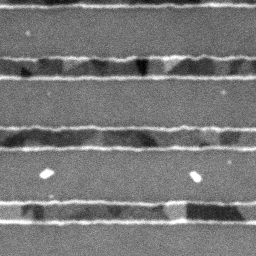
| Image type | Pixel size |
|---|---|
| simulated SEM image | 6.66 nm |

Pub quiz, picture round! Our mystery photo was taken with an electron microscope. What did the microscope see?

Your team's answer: lines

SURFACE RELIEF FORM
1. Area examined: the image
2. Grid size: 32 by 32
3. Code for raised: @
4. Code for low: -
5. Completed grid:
@@@@@@@@@@@@@@@@@@@@@@@@@@@@@@@@
--------------------------------
--------------------------------
--------------------------------
--------------------------------
--------------------------------
--------------------------------
@@@@@@@@@@@@@@@@@@@@@@@@@@@@@@@@
@@@@@@@@@@@@@@@@@@@@@@@@@@@@@@@@
@@@@@@@@@@@@@@@@@@@@@@@@@@@@@@@@
--------------------------------
--------------------------------
--------------------------------
--------------------------------
--------------------------------
--------------------------------
@@@@@@@@@@@@@@@@@@@@@@@@@@@@@@@@
@@@@@@@@@@@@@@@@@@@@@@@@@@@@@@@@
@@@@@@@@@@@@@@@@@@@@@@@@@@-@@@@@
--------------------------------
--------------------------------
--------------------------------
--------------------------------
--------------------------------
--------------------------------
@@@@@@@@@@@@@@@@@@@@@@@@@@@@@@@@
@@@@@@@@@@@@@@@@@@@@@@@@@@@@@@@@
@@@@@@@@@@@@@@@@@@@@@@@@@@@@@@@@
--------------------------------
--------------------------------
--------------------------------
--------------------------------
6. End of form